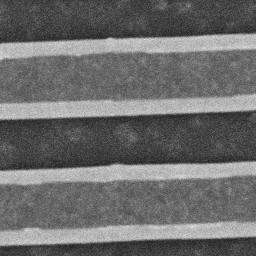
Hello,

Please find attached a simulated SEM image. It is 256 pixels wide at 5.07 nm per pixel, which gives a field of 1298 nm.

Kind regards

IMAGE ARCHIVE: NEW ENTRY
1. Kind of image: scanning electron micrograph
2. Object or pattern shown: one or a few lines or trenches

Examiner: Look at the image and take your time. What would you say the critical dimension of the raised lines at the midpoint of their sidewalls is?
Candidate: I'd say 319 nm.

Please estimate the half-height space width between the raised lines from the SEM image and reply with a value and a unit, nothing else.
322 nm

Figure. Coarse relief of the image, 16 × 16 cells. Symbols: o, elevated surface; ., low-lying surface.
................
................
................
oooooooooooooooo
oooooooooooooooo
oooooooooooooooo
ooooooooooooooo.
................
................
................
................
oooooooooooooooo
oooooooooooooooo
oooooooooooooooo
oooooooooooo....
................